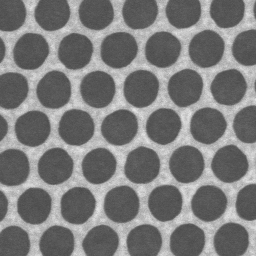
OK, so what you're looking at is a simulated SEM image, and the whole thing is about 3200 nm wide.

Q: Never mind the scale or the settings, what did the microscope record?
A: a regular array of holes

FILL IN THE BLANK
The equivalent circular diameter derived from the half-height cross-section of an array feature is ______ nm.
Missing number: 453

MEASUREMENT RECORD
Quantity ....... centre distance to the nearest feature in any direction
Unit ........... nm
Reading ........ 543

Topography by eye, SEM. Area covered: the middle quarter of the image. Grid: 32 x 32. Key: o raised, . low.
.....oooooo.....ooooooo...oooooo
oooooooooooooooooo..ooooooooo...
oooooo.....ooooo......ooooo.....
.oooo.......ooo........oooo.....
.ooo.........oo.........oo......
..oo.........oo.........oo......
..oo.........oo.........oo......
..oo.........oo........ooo......
.oooo.......ooo........oooo.....
.oooo.......oooo......ooooo.....
ooooooo....oooooo....ooooooo...o
o...ooooooooo...ooooooo....ooooo
......ooooo......ooooo......oooo
.......ooo........ooo........ooo
.......ooo........ooo........ooo
........o.........oo.........ooo
........o.........oo.........oo.
.......oo.........ooo........ooo
.......ooo.......oooo.......oooo
......ooooo.....ooooooo....ooooo
oo..ooooooooooooooo.oooooooooo..
ooooooo....oooooo.....oooooo....
.ooooo......oooo.......oooo.....
..ooo........ooo........oo......
..oo.........oo.........oo......
..oo.........oo.........oo......
..ooo........oo.........ooo.....
..ooo.......ooo.........ooo.....
.oooo.......oooo.......ooooo....
oooooo....ooooooo.....ooooooo...
oooooooooooooooooooooooo...ooooo
o.....ooooo.......oooo.......ooo